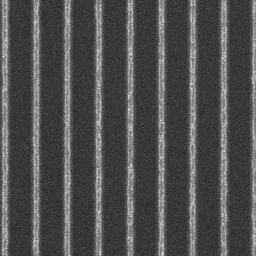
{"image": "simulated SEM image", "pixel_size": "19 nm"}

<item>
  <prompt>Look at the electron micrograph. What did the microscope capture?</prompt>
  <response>parallel lines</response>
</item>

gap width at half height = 447 nanometers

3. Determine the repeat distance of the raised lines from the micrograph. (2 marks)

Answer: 595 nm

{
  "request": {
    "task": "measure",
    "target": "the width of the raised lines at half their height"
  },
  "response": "138 nanometers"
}